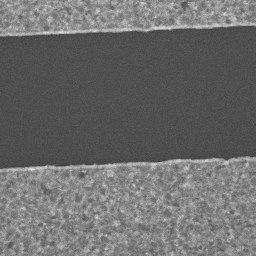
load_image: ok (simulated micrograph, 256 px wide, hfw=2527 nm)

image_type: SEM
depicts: one or a few lines or trenches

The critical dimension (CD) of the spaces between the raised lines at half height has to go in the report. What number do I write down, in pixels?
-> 135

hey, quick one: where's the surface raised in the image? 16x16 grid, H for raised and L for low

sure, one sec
HHHHHHHHHHHHHHHH
HHHHHHHHHHHHHHHL
LLLLLLLLLLLLLLLL
LLLLLLLLLLLLLLLL
LLLLLLLLLLLLLLLL
LLLLLLLLLLLLLLLL
LLLLLLLLLLLLLLLL
LLLLLLLLLLLLLLLL
LLLLLLLLLLLLLLLL
LLLLLLLLLLLLLLLL
LLLLHHHHHHHHHHHH
HHHHHHHHHHHHHHHH
HHHHHHHHHHHHHHHH
HHHHHHHHHHHHHHHH
HHHHHHHHHHHHHHHH
HHHHHHHHHHHHHHHH